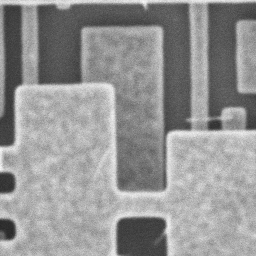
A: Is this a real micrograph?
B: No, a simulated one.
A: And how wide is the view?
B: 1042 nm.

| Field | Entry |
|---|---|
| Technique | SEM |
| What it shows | wiring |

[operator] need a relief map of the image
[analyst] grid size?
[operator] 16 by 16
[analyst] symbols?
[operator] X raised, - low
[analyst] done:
----------------
----------------
----------------
----------------
----------------
-XXXXXX---------
-XXXXXX---------
-XXXXXX---------
-XXXXXX----XXXXX
XXXXXXX---XXXXXX
XXXXXXX---XXXXXX
-XXXXXX---XXXXXX
XXXXXXXXXXXXXXXX
XXXXXXXXXXXXXXXX
-XXXXXX---XXXXXX
XXXXXXX---XXXXXX